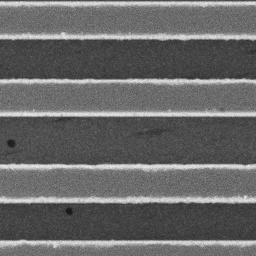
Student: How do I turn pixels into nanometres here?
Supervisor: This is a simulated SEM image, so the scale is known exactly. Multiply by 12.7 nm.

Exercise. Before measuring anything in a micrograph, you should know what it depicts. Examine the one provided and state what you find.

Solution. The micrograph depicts lines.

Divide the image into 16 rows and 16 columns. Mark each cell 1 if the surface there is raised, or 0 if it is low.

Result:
1111111111111111
1111111111111111
0000000000000000
0000000000000000
0000000000000000
1111111111111111
1111111111111111
0000000000000000
0000000000000000
0000000000000000
1111111111111111
1111111111111111
1111111111111111
0000000000000000
0000000000000000
1111111111111111